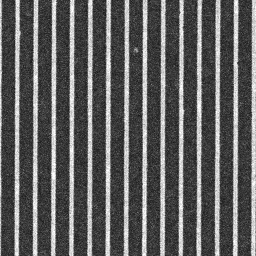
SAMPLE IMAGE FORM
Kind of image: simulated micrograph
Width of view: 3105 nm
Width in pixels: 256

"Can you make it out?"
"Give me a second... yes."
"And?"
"parallel lines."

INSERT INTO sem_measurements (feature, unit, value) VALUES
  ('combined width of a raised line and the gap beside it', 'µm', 0.221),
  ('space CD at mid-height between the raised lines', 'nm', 176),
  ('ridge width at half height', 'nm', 42.5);